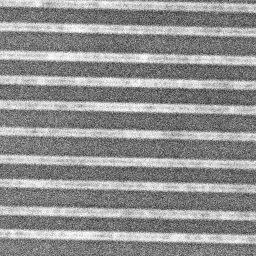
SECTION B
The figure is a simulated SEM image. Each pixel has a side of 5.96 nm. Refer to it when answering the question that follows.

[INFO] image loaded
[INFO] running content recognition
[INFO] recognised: parallel lines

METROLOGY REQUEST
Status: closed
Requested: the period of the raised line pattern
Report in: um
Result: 0.153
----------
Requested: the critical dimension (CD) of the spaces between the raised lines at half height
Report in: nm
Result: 109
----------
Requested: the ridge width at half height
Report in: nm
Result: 40.3